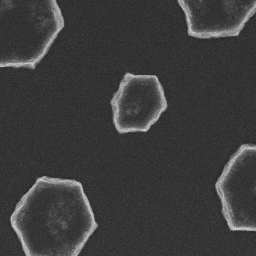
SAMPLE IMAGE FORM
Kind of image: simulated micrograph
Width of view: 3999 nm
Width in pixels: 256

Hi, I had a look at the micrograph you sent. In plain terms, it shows raised bodies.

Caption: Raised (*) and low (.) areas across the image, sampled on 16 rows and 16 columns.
****.......*****
****........***.
***.............
***.............
................
........**......
.......***......
.......***......
................
...............*
..............**
..***.........**
.****.........**
.*****........**
.*****..........
..***...........